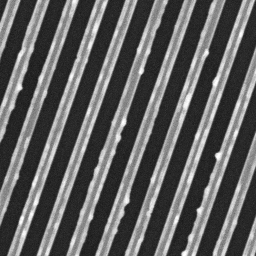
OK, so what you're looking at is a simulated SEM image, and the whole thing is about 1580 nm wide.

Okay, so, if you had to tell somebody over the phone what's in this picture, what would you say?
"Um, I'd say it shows parallel lines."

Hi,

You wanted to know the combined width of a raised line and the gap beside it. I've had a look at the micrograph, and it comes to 171 nm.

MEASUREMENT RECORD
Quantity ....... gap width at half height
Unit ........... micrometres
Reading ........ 0.102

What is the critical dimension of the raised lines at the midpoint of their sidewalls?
69.2 nanometres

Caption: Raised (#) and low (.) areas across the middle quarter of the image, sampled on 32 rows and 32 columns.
..###.....###....###.....##.....
..###....###.....###....###.....
..###....###....###.....###....#
.###.....###....###....###.....#
.###....###.....###....###....##
.##.....###....###.....###....##
###.....###....###....###.....##
###....###.....###....###....###
##.....###....###.....###....###
##.....##.....###....###.....###
##....###.....##.....###....###.
#.....###....###.....###....###.
#.....##.....###....###.....##..
#....###....####....###....###..
.....##.....####....##.....###..
.....##.....###....###.....##...
....###....####....###....###...
....##.....###.....###....##....
....##.....###....###.....##....
...###....####....###....###....
...###....###.....##.....##.....
...##.....###....###.....##.....
..###....####....###....###....#
..###....###.....##.....##.....#
.###.....###....###....###.....#
.###....###.....###....###.....#
.##.....###.....##.....###....##
###....####....###....###.....##
###....###.....###....###....###
##.....###....###.....###....###
##....####....###....###.....###
##....###.....###....###....###.